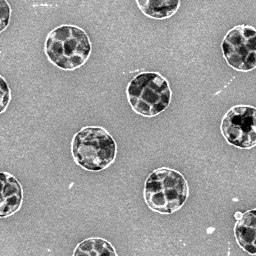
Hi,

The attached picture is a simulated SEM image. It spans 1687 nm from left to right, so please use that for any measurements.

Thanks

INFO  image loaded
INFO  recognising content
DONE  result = raised bodies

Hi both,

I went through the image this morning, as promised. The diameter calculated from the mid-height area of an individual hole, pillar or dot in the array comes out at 290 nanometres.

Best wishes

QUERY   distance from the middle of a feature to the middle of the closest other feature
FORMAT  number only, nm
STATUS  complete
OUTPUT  532